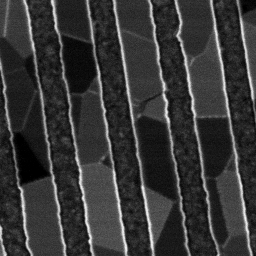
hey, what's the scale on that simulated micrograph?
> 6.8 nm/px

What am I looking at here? one or a few lines or trenches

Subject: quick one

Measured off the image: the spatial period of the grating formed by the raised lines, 416 nm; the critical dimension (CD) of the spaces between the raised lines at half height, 176 nm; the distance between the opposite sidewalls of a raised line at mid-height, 241 nm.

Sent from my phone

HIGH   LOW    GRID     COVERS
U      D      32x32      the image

UUUDDDDUUUUDDDUUUUUDDDUUUUDDDDUU
UUUDDDDUUUUDDDUUUUUDDDUUUUUDDDUU
UUUUDDDUUUUDDDDUUUUDDDDUUUUDDDUU
UUUUDDDUUUUDDDDUUUUDDDUUUUUDDDUU
UUUUDDDUUUUUDDDUUUUDDDUUUUUDDDUU
UUUUDDDDUUUUDDDUUUUUDDDUUUUDDDDU
UUUUDDDDUUUUDDDUUUUUDDDUUUUDDDDU
UUUUDDDDUUUUDDDUUUUUDDDUUUUUDDDU
UUUUUDDDUUUUDDDDUUUUDDDUUUUUDDDU
UUUUUDDDUUUUDDDDUUUUDDDDUUUUDDDU
UUUUUDDDUUUUUDDDUUUUDDDDUUUUDDDU
DUUUUDDDUUUUUDDDUUUUUDDDUUUUDDDU
DUUUUDDDDUUUUDDDUUUUUDDDUUUUDDDD
DUUUUDDDDUUUUDDDUUUUUDDDUUUUUDDD
DUUUUUDDDUUUUDDDUUUUUDDDUUUUUDDD
DUUUUUDDDUUUUDDDDUUUUDDDUUUUUDDD
DUUUUUDDDUUUUDDDDUUUUDDDDUUUUDDD
DUUUUUDDDUUUUUDDDUUUUDDDDUUUUDDD
DDUUUUDDDUUUUUDDDUUUUUDDDUUUUDDD
DDUUUUDDDDUUUUDDDUUUUUDDDUUUUUDD
DDUUUUDDDDUUUUDDDDUUUUDDDUUUUUDD
DDUUUUUDDDUUUUDDDDUUUUDDDUUUUUDD
DDUUUUUDDDUUUUDDDDUUUUDDDUUUUUDD
DDUUUUUDDDUUUUUDDDUUUUDDDDUUUUDD
DDDUUUUDDDUUUUUDDDUUUUUDDDUUUUDD
DDDUUUUDDDDUUUUDDDUUUUUDDDUUUUDD
DDDUUUUDDDDUUUUDDDUUUUUDDDUUUUUD
DDDUUUUUDDDUUUUDDDDUUUUDDDUUUUUD
DDDUUUUUDDDUUUUDDDDUUUUDDDUUUUUD
DDDUUUUUDDDUUUUUDDDUUUUDDDDUUUUD
DDDUUUUUDDDUUUUUDDDUUUUDDDDUUUUD
UDDDUUUUDDDUUUUUDDDUUUUUDDDUUUUD